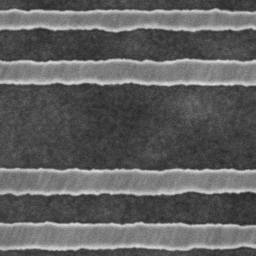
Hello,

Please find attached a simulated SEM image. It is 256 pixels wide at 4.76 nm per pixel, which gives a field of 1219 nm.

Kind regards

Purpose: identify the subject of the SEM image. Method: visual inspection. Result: lines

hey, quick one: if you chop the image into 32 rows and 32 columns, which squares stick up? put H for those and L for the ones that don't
LLLLLLLLLLLLLLLLLLLLLLLLLLLLLLLL
HHHHHHHHHHHHHHHHHHHHHHHHHHHHHHHH
HHHHHHHHHHHHHHHHHHHHHHHHHHHHHHHH
HHHHLLHHHHHHHHHHHLHLHHHHHHHHHHHH
LLLLLLLLLLLLLLLLLLLLLLLLLLLLLLLL
LLLLLLLLLLLLLLLLLLLLLLLLLLLLLLLL
LLLLLLLLLLLLLLLLLLLLLLLLLLLLLLLL
LLLLLLLLLLLLLHHHHLHLLLHHHLLHLLLL
HHHHHHHHHHHHHHHHHHHHHHHHHHHHHHHH
HHHHHHHHHHHHHHHHHHHHHHHHHHHHHHHH
LLHLHHLLHLLLHHHLLHHHHHHHHHHHHHHH
LLLLLLLLLLLLLLLLLLLLLLLLLLLLLLLL
LLLLLLLLLLLLLLLLLLLLLLLLLLLLLLLL
LLLLLLLLLLLLLLLLLLLLLLLLLLLLLLLL
LLLLLLLLLLLLLLLLLLLLLLLLLLLLLLLL
LLLLLLLLLLLLLLLLLLLLLLLLLLLLLLLL
LLLLLLLLLLLLLLLLLLLLLLLLLLLLLLLL
LLLLLLLLLLLLLLLLLLLLLLLLLLLLLLLL
LLLLLLLLLLLLLLLLLLLLLLLLLLLLLLLL
LLLLLLLLLLLLLLLLLLLLLLLLLLLLLLLL
LLLLLLLLLLLLLLLLLLLLLLLLLLLLLLLL
HHHHHHHHHHHHHHHHHHHHHHHHHHHHHHHH
HHHHHHHHHHHHHHHHHHHHHHHHHHHHHHHH
HHHHHHHHHHHHHHHHHHHHHHHHHHHHHHHH
LLLLLLLLLLLLLLLLLLLLLLLLLLLLLLLL
LLLLLLLLLLLLLLLLLLLLLLLLLLLLLLLL
LLLLLLLLLLLLLLLLLLLLLLLLLLLLLLLL
LLLLLLLLLLLLLLLLLLLLLLLLLLLLLLLL
HHHHHHHHHHHHHHHHHHHHHHHHHHHHHHHH
HHHHHHHHHHHHHHHHHHHHHHHHHHHHHHHH
HHHHHHHHHHHHHHHHHHHHHHHHHHHHHHHH
LLLLLLLLLLLLLLLLLLLLLLLLLLLLLLLL